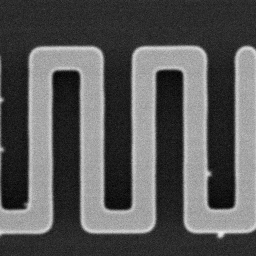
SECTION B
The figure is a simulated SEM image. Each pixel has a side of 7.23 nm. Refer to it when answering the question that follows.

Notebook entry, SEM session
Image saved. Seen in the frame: groups of lines, slits or small figures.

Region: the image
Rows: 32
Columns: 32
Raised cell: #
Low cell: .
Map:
................................
................................
................................
................................
................................
................................
....#########....#########....##
....#########....#########...###
....#########....#########...###
....###...###....##....###....##
....##....###....##....###...###
....##....###....##....###...###
....##....###....##....###....##
....##....###....##....###...###
....##....###....##....###...###
....##....###....##....###...###
....##....###....##....###....##
....##....###....##....###...###
....##....###....##....###...###
....##....###....##....###...###
....##....###....##....###...###
....##....###....##....###...###
....##....###....##....###....##
....##....###....##....###....##
....##....###....##....###....##
....###...###....##....###...###
#######...#########....#########
######....#########....#########
######....#########....#########
................................
................................
................................